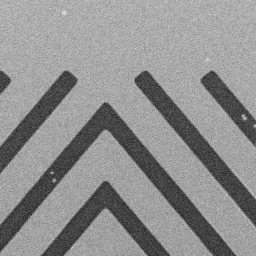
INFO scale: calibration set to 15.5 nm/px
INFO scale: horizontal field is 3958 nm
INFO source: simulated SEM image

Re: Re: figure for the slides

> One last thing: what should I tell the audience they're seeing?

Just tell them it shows groups of lines, slits or small figures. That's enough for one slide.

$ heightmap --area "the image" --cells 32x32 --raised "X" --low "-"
XXXXXXXXXXXXXXXXXXXXXXXXXXXXXXXX
XXXXXXXXXXXXXXXXXXXXXXXXXXXXXXXX
XXXXXXXXXXXXXXXXXXXXXXXXXXXXXXXX
XXXXXXXXXXXXXXXXXXXXXXXXXXXXXXXX
XXXXXXXXXXXXXXXXXXXXXXXXXXXXXXXX
XXXXXXXXXXXXXXXXXXXXXXXXXXXXXXXX
XXXXXXXXXXXXXXXXXXXXXXXXXXXXXXXX
XXXXXXXXXXXXXXXXXXXXXXXXXXXXXXXX
XXXXXXXXXXXXXXXXXXXXXXXXXXXXXXXX
-XXXXXX--XXXXXXXX--XXXXXX--XXXXX
-XXXXXX---XXXXXXX---XXXXX---XXXX
XXXXXX---XXXXXXXXX---XXXXX---XXX
XXXXX---XXXXXXXXXXX---XXXXX---XX
XXXX---XXXXX--XXXXX---XXXXXX---X
XXX---XXXXXX---XXXXX---XXXXXX---
XX---XXXXXX-----XXXXX---XXXXX---
X---XXXXXX-------XXXXX---XXXXX--
X---XXXXX---XX---XXXXXX---XXXXX-
---XXXXX---XXXX---XXXXXX---XXXXX
--XXXXX---XXXXXX---XXXXX---XXXXX
-XXXXX---XXXXXXXX---XXXXX---XXXX
XXXXXX---XXXXXXXXX---XXXXX---XXX
XXXXX---XXXXXXXXXXX---XXXXX---XX
XXXX---XXXXX--XXXXX----XXXXX---X
XXX---XXXXX----XXXXX---XXXXXX---
XX---XXXXX------XXXXX---XXXXX---
X---XXXXXX---X---XXXXX---XXXXX--
---XXXXXX---XXX---XXXXX---XXXXX-
---XXXXX---XXXX---XXXXXX---XXXXX
--XXXXX---XXXXXX---XXXXXX---XXXX
-XXXXX---XXXXXXXX---XXXXX---XXXX
XXXXX---XXXXXXXXXX---XXXXX---XXX